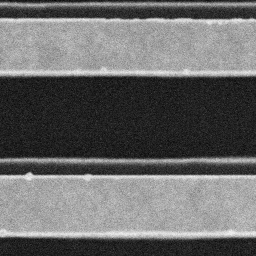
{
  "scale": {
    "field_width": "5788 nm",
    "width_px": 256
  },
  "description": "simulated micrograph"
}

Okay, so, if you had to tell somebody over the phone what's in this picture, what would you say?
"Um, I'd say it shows lines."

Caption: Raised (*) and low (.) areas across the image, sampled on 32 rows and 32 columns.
................................
********************************
********************************
********************************
********************************
********************************
********************************
********************************
********************************
................................
................................
................................
................................
................................
................................
................................
................................
................................
................................
................................
********************************
********************************
********************************
********************************
********************************
********************************
********************************
********************************
********************************
................................
................................
................................